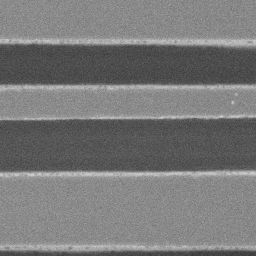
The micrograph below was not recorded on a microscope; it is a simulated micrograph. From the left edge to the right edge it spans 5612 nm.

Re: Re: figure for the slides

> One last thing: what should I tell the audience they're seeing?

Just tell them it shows lines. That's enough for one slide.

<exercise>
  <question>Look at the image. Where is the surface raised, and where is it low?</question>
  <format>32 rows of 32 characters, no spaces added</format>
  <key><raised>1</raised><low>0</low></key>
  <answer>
11111111111111111111111111111111
11111111111111111111111111111111
11111111111111111111111111111111
11111111111111111111111111111111
11111111111111111111111111111111
00000000000000000000000000000000
00000000000000000000000000000000
00000000000000000000000000000000
00000000000000000000000000000000
00000000000000000000000000000000
00000000000000000000000000000000
11111111111111111111111111111111
11111111111111111111111111111111
11111111111111111111111111111111
11111111111111111111111111111111
00000000000000000000000000000000
00000000000000000000000000000000
00000000000000000000000000000000
00000000000000000000000000000000
00000000000000000000000000000000
00000000000000000000000000000000
00000000000000000000000000000000
11111111111111111111111111111111
11111111111111111111111111111111
11111111111111111111111111111111
11111111111111111111111111111111
11111111111111111111111111111111
11111111111111111111111111111111
11111111111111111111111111111111
11111111111111111111111111111111
11111111111111111111111111111111
00000000000000000000000000000000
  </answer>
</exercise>